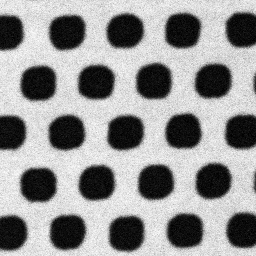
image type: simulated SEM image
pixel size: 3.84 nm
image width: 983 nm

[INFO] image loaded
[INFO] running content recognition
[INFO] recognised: a regular array of holes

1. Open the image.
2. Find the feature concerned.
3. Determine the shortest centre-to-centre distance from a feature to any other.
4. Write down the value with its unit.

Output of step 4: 57.7 px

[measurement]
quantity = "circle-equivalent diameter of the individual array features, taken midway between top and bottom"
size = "139 nm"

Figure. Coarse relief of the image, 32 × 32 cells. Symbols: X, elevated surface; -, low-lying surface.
XXXXXXXXXXXXXXXXXXXXXXXXXXXXXXXX
XXXXXXXXXXXXXXXXXXXXXXXXXXXXXXXX
--XXXXX---XXXX----XXX----XXX----
---XXX-----XX-----XXX----XXX----
---XXX----XXX-----XXX----XXX----
--XXXXX---XXXX---XXXX---XXXXX---
XXXXXXXXXXXXXXXXXXXXXXXXXXXXXXXX
XXXXXXXXXXXXXXXXXXXXXXXXXXXXXXXX
XXXX--XXXXX---XXXX---XXXX---XXXX
XXX----XXX----XXX----XXXX----XXX
XXX----XXX----XXX----XXX-----XXX
XXX----XXX----XXX----XXXX---XXXX
XXXX-XXXXXXXXXXXXXXXXXXXXXXXXXXX
XXXXXXXXXXXXXXXXXXXXXXXXXXXXXXXX
XXXXXXXX-XXXXXX--XXXXX--XXXXX---
---XXX----XXXX----XXX----XXX----
---XXX-----XX-----XXX----XXX----
---XXX----XXXX----XXX----XXX----
--XXXXX--XXXXX---XXXXX--XXXXX--X
XXXXXXXXXXXXXXXXXXXXXXXXXXXXXXXX
XXXXXXXXXXXXXXXXXXXXXXXXXX--XXXX
XXX----XXX----XXXX---XXXX----XXX
XXX----XXX----XXX-----XXX----XXX
XXX----XXX----XXX-----XXX----XXX
XXX----XXX----XXXX---XXXX---XXXX
XXXXXXXXXXXXXXXXXXXXXXXXXXXXXXXX
XXXXXXXXXXXXXXXXXXXXXXXXXXXXXXXX
---XXXX---XXXX----XXX----XXXX---
---XXX-----XXX----XXX----XXX----
---XXX-----XXX----XXX----XXX----
---XXXX---XXXX----XXXX---XXXX---
XXXXXXXXXXXXXXXXXXXXXXXXXXXXXXXX